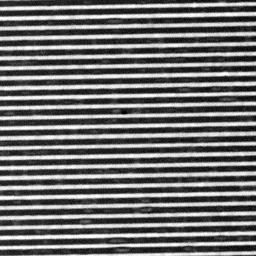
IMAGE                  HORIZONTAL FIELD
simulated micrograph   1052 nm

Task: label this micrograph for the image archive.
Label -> parallel lines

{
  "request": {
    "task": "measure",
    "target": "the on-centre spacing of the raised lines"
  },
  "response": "40.9 nanometres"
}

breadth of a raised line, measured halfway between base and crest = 9.2 nanometers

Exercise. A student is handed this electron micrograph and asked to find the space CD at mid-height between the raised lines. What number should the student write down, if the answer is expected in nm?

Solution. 30.8